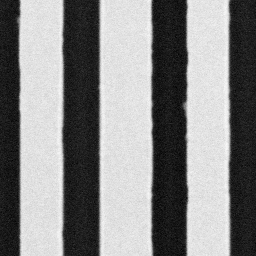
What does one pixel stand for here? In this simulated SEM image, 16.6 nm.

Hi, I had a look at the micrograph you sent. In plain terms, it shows lines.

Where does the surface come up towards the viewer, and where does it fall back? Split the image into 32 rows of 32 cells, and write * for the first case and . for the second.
...*****.....******....******...
...*****.....******....******...
...*****.....******....******...
..******.....******....******...
..******.....******....******...
..******.....******....******...
..******.....******....******...
..******.....******.....*****...
..******.....******....******...
...*****.....******....******...
...*****.....******....******...
..******.....******....******...
..******.....******....******...
..******.....******....******...
...*****.....******....******...
...*****.....******....******...
...*****.....******....******...
...*****.....******....******...
...*****.....******....******...
...*****.....******....******...
...*****.....******....******...
...*****.....******....******...
...*****.....******....******...
...*****.....******....******...
...*****.....******.....*****...
...*****.....******....******...
...*****.....******....******...
...*****.....******....******...
...*****.....******....******...
..******.....******....******...
...*****.....******....******...
...*****.....******....******...